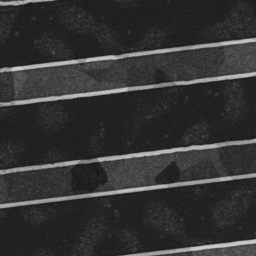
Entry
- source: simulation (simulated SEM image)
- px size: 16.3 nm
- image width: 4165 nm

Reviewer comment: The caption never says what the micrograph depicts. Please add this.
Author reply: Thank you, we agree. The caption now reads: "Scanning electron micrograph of one or a few lines or trenches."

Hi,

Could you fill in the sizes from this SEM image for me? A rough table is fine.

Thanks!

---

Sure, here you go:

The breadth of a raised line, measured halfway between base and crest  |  0.559 um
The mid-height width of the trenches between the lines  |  1080 nm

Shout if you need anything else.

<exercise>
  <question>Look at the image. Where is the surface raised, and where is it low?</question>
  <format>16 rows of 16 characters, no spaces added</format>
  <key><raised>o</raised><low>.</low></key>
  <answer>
................
................
................
........oooooooo
oooooooooooooooo
ooooooooo.......
................
................
................
..........oooooo
..oooooooooooooo
ooooooooooo.....
ooo.............
................
................
............oooo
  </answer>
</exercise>